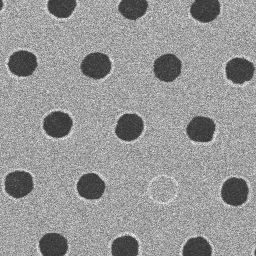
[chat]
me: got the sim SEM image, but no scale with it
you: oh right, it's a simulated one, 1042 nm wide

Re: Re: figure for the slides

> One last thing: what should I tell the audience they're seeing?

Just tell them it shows a regular array of holes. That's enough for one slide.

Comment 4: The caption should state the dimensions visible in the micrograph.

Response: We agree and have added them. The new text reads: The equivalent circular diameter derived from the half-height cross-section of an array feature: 27.2 px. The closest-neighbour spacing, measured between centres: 70.2 px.